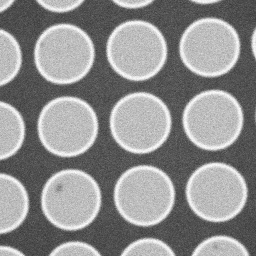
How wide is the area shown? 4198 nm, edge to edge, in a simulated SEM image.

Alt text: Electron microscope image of an array of small figures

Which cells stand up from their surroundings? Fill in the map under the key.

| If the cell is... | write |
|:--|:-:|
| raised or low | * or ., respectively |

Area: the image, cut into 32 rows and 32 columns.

*....*****.....***..............
................................
.........................**.....
......****.....****.....*****...
*....******...******...*******..
**...******..********..*******..
**..********..*******..*******..
***.********..*******..******...
**...******...******....*****...
**....****......***.............
................................
..........................**....
.......***.....*****....*****...
**....*****...*******..*******..
**...*******..*******..*******..
***..*******..*******..*******..
***..*******..*******..*******..
***..*******...*****....*****...
**....*****.....****.....***....
*...............................
...........................*....
........**......****....******..
**....******...******...******..
***...******..********.********.
***..*******..********.********.
***..*******..********..******..
***...******...******...******..
***...******....****......**....
**......**......................
................................
........***......****....*****..
**.....*****....******..*******.